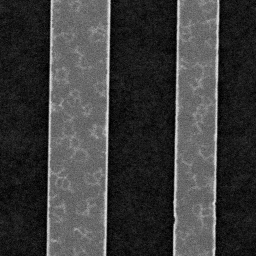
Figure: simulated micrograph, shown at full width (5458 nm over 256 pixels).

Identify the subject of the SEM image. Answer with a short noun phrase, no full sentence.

one or a few lines or trenches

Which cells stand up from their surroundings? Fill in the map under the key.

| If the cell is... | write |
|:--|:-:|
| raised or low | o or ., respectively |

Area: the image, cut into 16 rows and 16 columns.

...oooo....ooo..
...oooo....ooo..
...oooo....ooo..
...oooo....ooo..
...oooo....ooo..
...oooo....ooo..
...oooo....ooo..
...oooo....ooo..
...oooo....ooo..
...oooo....oo...
...oooo....oo...
...oooo....oo...
...oooo....oo...
...oooo....oo...
...oooo....oo...
...oooo....oo...